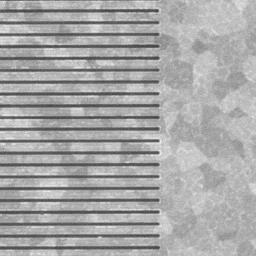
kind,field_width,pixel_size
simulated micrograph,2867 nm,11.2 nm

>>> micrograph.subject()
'parallel lines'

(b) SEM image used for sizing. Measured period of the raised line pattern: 133 nm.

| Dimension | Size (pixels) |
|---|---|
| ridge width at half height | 8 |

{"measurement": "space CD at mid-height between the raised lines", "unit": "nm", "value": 40.6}